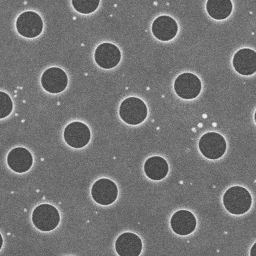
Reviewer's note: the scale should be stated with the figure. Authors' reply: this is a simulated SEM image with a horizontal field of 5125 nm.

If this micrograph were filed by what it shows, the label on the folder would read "a regular array of holes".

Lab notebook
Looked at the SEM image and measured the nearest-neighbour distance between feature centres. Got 1.19 um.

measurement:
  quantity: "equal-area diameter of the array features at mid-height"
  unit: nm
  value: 536